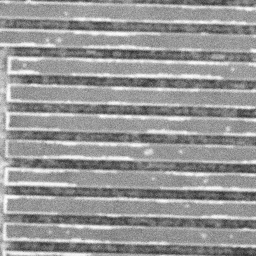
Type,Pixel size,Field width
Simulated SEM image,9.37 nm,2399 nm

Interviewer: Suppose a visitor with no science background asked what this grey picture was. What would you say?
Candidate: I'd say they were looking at parallel lines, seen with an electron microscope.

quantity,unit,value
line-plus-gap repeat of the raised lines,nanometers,260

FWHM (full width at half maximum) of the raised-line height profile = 159 nanometers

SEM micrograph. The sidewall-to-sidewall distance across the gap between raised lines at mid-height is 0.0972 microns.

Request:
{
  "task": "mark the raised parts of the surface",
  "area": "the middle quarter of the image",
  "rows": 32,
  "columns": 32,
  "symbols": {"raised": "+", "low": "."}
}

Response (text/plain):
++++++++++++++++++++++++++++++++
++++++++++++++++++++++++++++++++
++++++++++++++++++++++++++++++++
.............................+++
................................
................................
++++++++++++++++++++++++++++++++
++++++++++++++++++++++++++++++++
++++++++++++++++++++++++++++++++
++++++++++++++++++++++++++++++++
................................
................................
................................
++++++++++++++++++++++++++++++++
++++++++++++++++++++++++++++++++
++++++++++++++++++++++++++++++++
++++++++++++++++++++++++++++++++
................................
................................
................................
++++++++++++++++++++++++++++++++
++++++++++++++++++++++++++++++++
++++++++++++++++++++++++++++++++
++++++++++++++++++++++++++++++++
................................
................................
.++++...........................
++++++++++++++++++++++++++++++++
++++++++++++++++++++++++++++++++
++++++++++++++++++++++++++++++++
....++++++++++++++++++++++++++++
................................